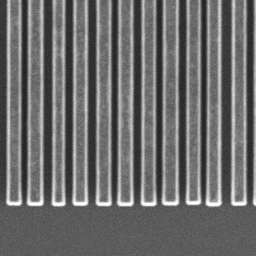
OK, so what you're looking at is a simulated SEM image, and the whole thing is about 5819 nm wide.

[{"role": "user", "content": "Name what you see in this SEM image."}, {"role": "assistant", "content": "parallel lines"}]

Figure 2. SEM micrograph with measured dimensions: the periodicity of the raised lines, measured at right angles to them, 511 nanometres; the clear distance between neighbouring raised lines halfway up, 204 nm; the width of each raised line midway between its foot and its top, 295 nm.